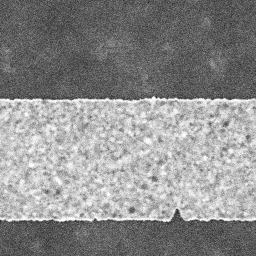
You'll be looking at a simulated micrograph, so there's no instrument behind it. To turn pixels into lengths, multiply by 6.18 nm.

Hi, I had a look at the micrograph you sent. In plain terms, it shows one or a few lines or trenches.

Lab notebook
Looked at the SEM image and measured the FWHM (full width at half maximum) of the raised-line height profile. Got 741 nm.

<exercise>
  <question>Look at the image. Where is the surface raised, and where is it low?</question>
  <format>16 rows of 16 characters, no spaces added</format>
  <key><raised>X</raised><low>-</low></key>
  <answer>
----------------
----------------
----------------
----------------
----------------
----------------
XXXXXXXXXXXXXXXX
XXXXXXXXXXXXXXXX
XXXXXXXXXXXXXXXX
XXXXXXXXXXXXXXXX
XXXXXXXXXXXXXXXX
XXXXXXXXXXXXXXXX
XXXXXXXXXXXXXXXX
XXXXXXXXXXXXXXXX
----------------
----------------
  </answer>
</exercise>